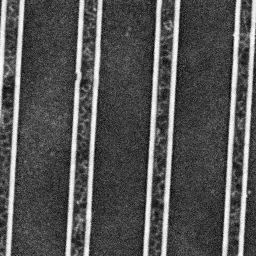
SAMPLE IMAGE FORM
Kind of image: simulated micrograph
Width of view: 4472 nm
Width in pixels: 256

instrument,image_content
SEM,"one or a few lines or trenches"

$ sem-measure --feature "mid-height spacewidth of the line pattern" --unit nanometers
1040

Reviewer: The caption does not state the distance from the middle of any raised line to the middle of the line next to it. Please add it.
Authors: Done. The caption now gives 1360 nanometers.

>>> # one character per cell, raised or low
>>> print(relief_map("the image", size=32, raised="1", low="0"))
11100000001100000000110000000011
11100000001100000000110000000011
11100000001100000000110000000011
11100000001100000000110000000011
11100000001100000000110000000111
11000000001100000000110000000111
11000000001100000000110000000110
11000000001100000000110000000110
11000000001100000001110000000110
11000000001100000001110000000110
11000000001100000001110000000110
11000000001100000001110000000110
11000000001100000001110000000110
11000000001100000001110000000110
11000000011100000001100000000110
11000000011100000001100000000110
11000000011100000001100000000110
11000000011100000001100000000110
11000000011100000001100000000110
11000000011000000001100000000110
11000000011000000001100000000110
11000000011000000001100000000110
11000000011000000001100000000110
10000000011000000001100000000110
10000000011000000001100000001110
10000000011000000001100000001100
10000000011000000011100000001100
10000000011000000011100000001100
10000000011000000011100000001100
10000000011000000011100000001100
10000000011000000011000000001100
10000000111000000011000000001100